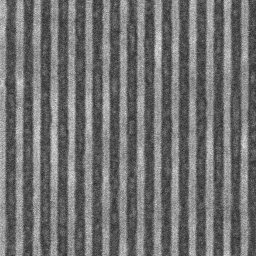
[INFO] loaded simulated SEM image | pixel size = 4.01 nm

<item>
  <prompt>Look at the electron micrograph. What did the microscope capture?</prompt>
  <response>parallel lines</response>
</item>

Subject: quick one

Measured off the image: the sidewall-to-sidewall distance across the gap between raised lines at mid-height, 0.0461 um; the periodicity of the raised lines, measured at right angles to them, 69.3 nm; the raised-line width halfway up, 0.025 micrometres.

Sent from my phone